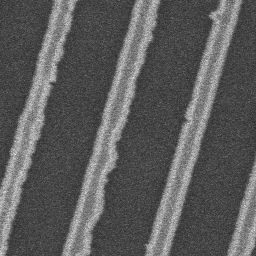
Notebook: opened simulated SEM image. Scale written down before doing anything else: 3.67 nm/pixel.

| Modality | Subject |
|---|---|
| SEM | one or a few lines or trenches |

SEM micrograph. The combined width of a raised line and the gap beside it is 290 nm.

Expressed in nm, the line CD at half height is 61.2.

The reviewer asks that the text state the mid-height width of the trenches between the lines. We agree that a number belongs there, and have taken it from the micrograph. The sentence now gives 228 nm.